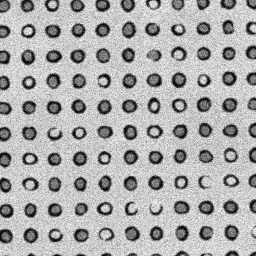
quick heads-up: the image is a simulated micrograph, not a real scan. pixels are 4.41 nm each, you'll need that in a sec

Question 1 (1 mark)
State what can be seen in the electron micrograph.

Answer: a regular array of ring-shaped grooves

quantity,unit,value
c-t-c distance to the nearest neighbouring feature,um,0.108